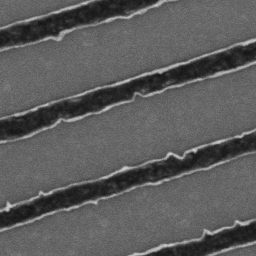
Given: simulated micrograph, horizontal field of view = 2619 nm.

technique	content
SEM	one or a few lines or trenches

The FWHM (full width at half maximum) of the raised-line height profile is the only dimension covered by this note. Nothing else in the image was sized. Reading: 22.7 pixels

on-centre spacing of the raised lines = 0.875 micrometres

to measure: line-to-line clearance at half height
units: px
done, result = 62.6